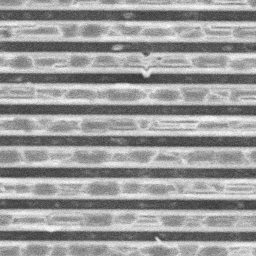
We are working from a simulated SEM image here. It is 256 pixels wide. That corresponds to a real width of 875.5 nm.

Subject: parallel lines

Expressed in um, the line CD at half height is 0.0607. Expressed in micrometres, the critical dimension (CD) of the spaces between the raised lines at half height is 0.0471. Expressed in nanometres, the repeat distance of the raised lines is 108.